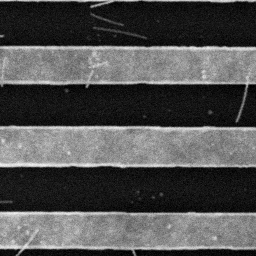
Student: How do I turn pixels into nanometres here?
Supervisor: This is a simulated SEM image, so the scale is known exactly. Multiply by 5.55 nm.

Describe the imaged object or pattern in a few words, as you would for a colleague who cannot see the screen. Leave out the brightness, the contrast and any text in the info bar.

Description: lines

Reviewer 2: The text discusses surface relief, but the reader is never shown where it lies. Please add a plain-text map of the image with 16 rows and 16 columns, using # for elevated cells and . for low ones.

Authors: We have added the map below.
................
................
................
################
################
................
................
................
################
################
................
................
................
################
################
.#...########.##